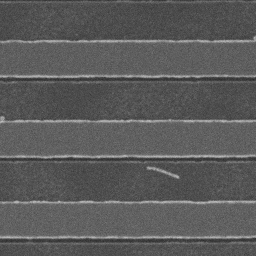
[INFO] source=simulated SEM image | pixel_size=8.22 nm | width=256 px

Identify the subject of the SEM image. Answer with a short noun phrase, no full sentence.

lines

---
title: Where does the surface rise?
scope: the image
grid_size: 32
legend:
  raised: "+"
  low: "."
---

................................
................................
................................
................................
................................
++++++++++++++++++++++++++++++++
++++++++++++++++++++++++++++++++
++++++++++++++++++++++++++++++++
++++++++++++++++++++++++++++++++
++++++++++++++++++++++++++++++++
................................
................................
................................
................................
................................
++++++++++++++++++++++++++++++++
++++++++++++++++++++++++++++++++
++++++++++++++++++++++++++++++++
++++++++++++++++++++++++++++++++
++++++++++++++++++++++++++++++++
................................
................................
................................
................................
................................
++++++++++++++++++++++++++++++++
++++++++++++++++++++++++++++++++
++++++++++++++++++++++++++++++++
++++++++++++++++++++++++++++++++
++++++++++++++++++++++++++++++++
................................
................................